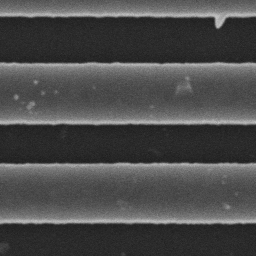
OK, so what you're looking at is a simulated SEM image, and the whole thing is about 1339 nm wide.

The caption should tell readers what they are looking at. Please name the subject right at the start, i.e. lines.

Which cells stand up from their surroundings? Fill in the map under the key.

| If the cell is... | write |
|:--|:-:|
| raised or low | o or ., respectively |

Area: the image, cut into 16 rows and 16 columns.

oooooooooooooooo
................
................
................
oooooooooooooooo
oooooooooooooooo
oooooooooooooooo
oooooooooooooooo
................
................
oooooooooooooooo
oooooooooooooooo
oooooooooooooooo
oooooooooooooooo
................
................